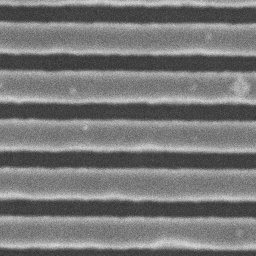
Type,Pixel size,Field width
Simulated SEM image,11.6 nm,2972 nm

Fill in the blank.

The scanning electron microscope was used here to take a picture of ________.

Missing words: lines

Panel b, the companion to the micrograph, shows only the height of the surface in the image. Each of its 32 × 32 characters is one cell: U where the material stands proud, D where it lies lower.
DUUUUUUUUUUUDUUUUUUUUUUUUUUUUUUU
DDDDDDDDDDDDDDDDDDDDDDDDDDDDDDDD
DDDDDDDDDDDDDDDDDDDDDDDDDDDDDDDD
UUUUUUUUUUUUUUUUUUUUUUUUUUUUUUUU
UUUUUUUUUUUUUUUUUUUUUUUUUUUUUUUU
UUUUUUUUUUUUUUUUUUUUUUUUUUUUUUUU
UUUUUUUUUUUUUUUUUUUUUUUUUUUUUUUU
DDDDDDDDDDDDDDDDDDDDDDDDDDDDDDDD
DDDDDDDDDDDDDDDDDDDDDDDDDDDDDDDD
UUUUUUUUUUUUUUUUUUUUUUUUUUUUUUUU
UUUUUUUUUUUUUUUUUUUUUUUUUUUUUUUU
UUUUUUUUUUUUUUUUUUUUUUUUUUUUUUUU
UUUUUUUUUUUUUUUUUUUUUUUUUUUUUUUU
DDDDDDDDDDDDDDDDDDDDDDDDDDDDDDDD
DDDDDDDDDDDDDDDDDDDDDDDDDDDDDDDD
UUUUUUUUUUUUUUUUUUUUUUUUUUUUUUUU
UUUUUUUUUUUUUUUUUUUUUUUUUUUUUUUU
UUUUUUUUUUUUUUUUUUUUUUUUUUUUUUUU
UUUUUUUUUUUUUUUUUUUUUUUUUUUUUUUU
DDDDDDDDDDDDDDDDDDDDDDDDDDDDDDDD
DDDDDDDDDDDDDDDDDDDDDDDDDDDDDDDD
UUUUUUUUUUUUUUUUUUUUUUUUUUUUUUUU
UUUUUUUUUUUUUUUUUUUUUUUUUUUUUUUU
UUUUUUUUUUUUUUUUUUUUUUUUUUUUUUUU
UUUUUUUUUUUUUUUUUUUUUUUUUUUUUUUU
DDDDDDDDDDDDDDDDDDDDDDDDDDDDDDDD
DDDDDDDDDDDDDDDDDDDDDDDDDDDDDDDD
UUUUUUUUUUUUUUUUUUUUUUUUUUUUUUUU
UUUUUUUUUUUUUUUUUUUUUUUUUUUUUUUU
UUUUUUUUUUUUUUUUUUUUUUUUUUUUUUUU
UUUUUUUUUUUUUUUUUUUUUUUUUUUUUUUU
DDDDDDDDDDDDDDDDDDDDDDDDDDDDDDDD